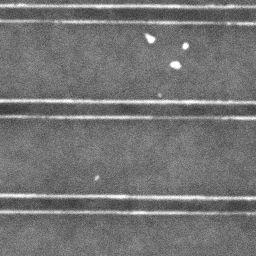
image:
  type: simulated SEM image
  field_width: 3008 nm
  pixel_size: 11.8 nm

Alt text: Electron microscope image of lines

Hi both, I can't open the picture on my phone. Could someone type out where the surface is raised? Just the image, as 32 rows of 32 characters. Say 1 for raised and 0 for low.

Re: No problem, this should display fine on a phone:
00000000000000000000000000000000
11111111111111111111111111111111
11111111111111111111111111111111
00000000000000000000000000000000
00000000000000000000000000000000
00000000000000000000000000000000
00000000000000000000000000000000
00000000000000000000000000000000
00000000000000000000000000000000
00000000000000000000000000000000
00000000000000000000000000000000
00000000000000000000000000000000
00000000000000000000000000000000
11111111111111111111111111111111
11111111111111111111111111111111
00000000000000000000000000000000
00000000000000000000000000000000
00000000000000000000000000000000
00000000000000000000000000000000
00000000000000000000000000000000
00000000000000000000000000000000
00000000000000000000000000000000
00000000000000000000000000000000
00000000000000000000000000000000
11111000000000000000000000000000
11111111111111111111111111111111
11111111111111111111111111111111
00000000000000000000000000000000
00000000000000000000000000000000
00000000000000000000000000000000
00000000000000000000000000000000
00000000000000000000000000000000